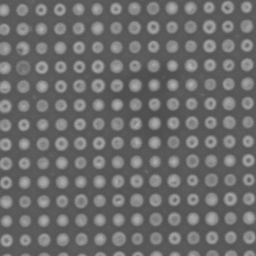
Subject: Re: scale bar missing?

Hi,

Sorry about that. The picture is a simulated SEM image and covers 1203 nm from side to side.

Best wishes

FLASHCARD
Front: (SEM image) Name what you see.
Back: a regular array of raised bodies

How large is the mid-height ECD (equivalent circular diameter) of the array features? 56.6 nm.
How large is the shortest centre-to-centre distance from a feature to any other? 0.0871 um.